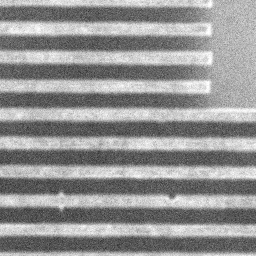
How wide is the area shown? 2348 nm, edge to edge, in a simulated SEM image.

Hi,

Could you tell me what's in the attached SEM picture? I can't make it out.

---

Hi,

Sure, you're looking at parallel lines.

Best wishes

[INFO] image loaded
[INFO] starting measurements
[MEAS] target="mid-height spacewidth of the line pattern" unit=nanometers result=166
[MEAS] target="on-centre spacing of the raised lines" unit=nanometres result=263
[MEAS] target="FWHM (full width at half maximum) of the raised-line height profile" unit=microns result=0.0917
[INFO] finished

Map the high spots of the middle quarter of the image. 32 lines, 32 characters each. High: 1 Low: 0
00000000000000000000000000000000
00000000000000000000000000000000
00000000000000000000000000000000
00000000000000000000000000000000
11111111111111111000000000000000
11111111111111111111111111111111
11111111111111111111111111111111
00000000000000000000000000000000
00000000000000000000000000000000
00000000000000000000000000000000
00000000000000000000000000000000
11111111110000000000000000000000
11111111111111111111111111111111
11111111111111111111111111111111
00000000000000000000000000000000
00000000000000000000000000000000
00000000000000000000000000000000
00000000000000000000000000000000
00000000000000000000000000000000
11111111111111111111111111111111
11111111111111111111111111111111
00000000000000000000000000000000
00000000000000000000000000000000
00000000000000000000000000000000
00000000000000000000000000000000
00000000000000000000000000000000
11111111111111111111111111111111
11111111111111111111111111111111
00000000000000000000000000000000
00000000000000000000000000000000
00000000000000000000000000000000
00000000000000000000000000000000